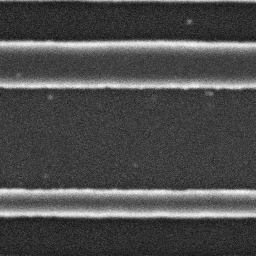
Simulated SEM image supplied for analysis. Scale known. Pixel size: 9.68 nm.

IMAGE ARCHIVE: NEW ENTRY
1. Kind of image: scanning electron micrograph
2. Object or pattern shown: lines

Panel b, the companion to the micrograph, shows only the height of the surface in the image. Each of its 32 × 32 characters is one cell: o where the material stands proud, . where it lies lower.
................................
................................
................................
................................
................................
..oo.oo.........................
oooooooooooooooooooooooooooooooo
oooooooooooooooooooooooooooooooo
oooooooooooooooooooooooooooooooo
oooooooooooooooooooooooooooooooo
oooooooooooooooooooooooooooooooo
................................
................................
................................
................................
................................
................................
................................
................................
................................
................................
................................
................................
................................
oooooooooooooooooooooooooooooooo
oooooooooooooooooooooooooooooooo
oooooooooooooooooooooooooooooooo
................................
................................
................................
................................
................................